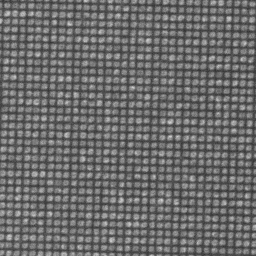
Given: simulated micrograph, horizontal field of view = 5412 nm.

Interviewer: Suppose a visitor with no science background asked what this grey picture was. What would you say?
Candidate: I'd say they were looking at a regular array of raised bodies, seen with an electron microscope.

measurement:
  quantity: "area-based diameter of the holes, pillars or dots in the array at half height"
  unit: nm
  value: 104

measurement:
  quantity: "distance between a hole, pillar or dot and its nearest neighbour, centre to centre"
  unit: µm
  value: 0.159